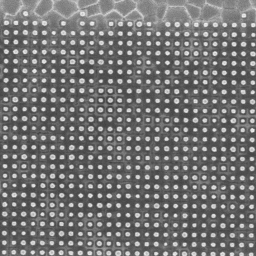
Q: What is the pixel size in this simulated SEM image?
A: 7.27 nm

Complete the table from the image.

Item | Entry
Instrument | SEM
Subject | a regular array of raised bodies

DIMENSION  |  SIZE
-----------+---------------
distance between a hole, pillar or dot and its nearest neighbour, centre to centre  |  9.27 px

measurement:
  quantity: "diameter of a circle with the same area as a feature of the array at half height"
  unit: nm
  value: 30.7